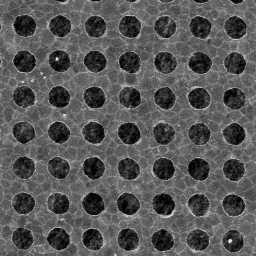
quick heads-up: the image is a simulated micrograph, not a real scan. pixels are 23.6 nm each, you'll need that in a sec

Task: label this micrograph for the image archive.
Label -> a regular array of holes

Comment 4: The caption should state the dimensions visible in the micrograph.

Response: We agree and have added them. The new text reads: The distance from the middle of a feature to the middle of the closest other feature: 822 nm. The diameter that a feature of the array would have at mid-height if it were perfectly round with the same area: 538 nm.